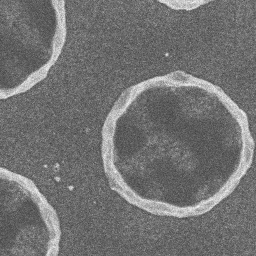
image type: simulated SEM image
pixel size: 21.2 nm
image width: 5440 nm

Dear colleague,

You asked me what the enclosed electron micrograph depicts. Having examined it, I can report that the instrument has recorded raised bodies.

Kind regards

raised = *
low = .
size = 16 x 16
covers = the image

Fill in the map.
****............
****............
****............
***.............
***.............
*........****...
........******..
.......********.
.......********.
.......********.
.......********.
**.....*******..
***.....*****...
***.............
***.............
***.............